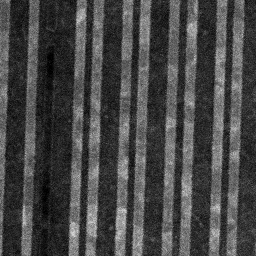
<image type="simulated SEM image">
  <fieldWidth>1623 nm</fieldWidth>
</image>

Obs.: parallel lines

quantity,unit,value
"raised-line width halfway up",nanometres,58.6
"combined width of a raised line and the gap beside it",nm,144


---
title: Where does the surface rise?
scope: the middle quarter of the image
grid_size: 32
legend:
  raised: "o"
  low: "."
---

...oo..oo......oo..oo.....oo...o
...oo..oo.....ooo..oo.....oo...o
...oo..oo.....ooo..oo.....oo...o
...oo..oo.....ooo..oo.....oo...o
...oo..oo.....ooo..oo.....oo...o
...oo..oo.....oo...oo.....oo..oo
...oo..oo.....oo...oo.....oo..oo
...oo..oo.....oo...oo.....oo..oo
...oo..oo.....oo...oo.....oo..oo
...oo..oo.....oo...oo.....oo..oo
...oo..oo.....oo..ooo.....oo..oo
...oo..oo.....oo..ooo.....oo..oo
..ooo..oo.....oo..ooo.....oo..oo
..ooo..oo.....oo..oo......oo..oo
..ooo..oo.....oo..oo......oo..oo
..oo...oo.....oo..oo......oo..oo
..oo...oo.....oo..oo......oo..oo
..oo...oo.....oo..oo......oo..oo
..oo...oo.....oo..oo......oo..oo
..oo...oo.....oo..oo......oo..oo
..oo..ooo.....oo..oo......oo..oo
..oo..ooo.....oo..oo.....ooo..oo
..oo..ooo.....oo..oo.....ooo..oo
..oo..ooo.....oo..oo.....ooo..oo
..oo..oo......oo..oo.....oo...oo
..oo..oo......oo..oo.....oo...oo
..oo..oo......oo..oo.....oo...oo
..oo..oo......oo..oo.....oo...oo
..oo..oo......oo..oo.....oo...oo
..oo..oo......oo..oo.....oo...oo
..oo..oo......oo..oo.....oo...oo
..oo..oo......oo..oo.....oo...oo